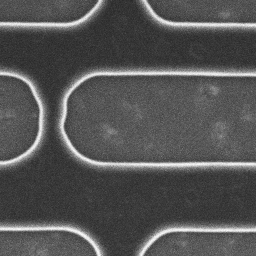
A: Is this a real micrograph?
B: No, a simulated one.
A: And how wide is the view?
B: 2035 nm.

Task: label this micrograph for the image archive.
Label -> one or a few lines or trenches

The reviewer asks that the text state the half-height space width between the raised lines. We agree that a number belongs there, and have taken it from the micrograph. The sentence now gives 89.5 px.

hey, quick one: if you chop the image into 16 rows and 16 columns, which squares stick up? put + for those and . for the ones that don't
......+++.......
++..+++++++.....
++++++++++++++++
++++++++++++++++
++++++++++++++++
..+++...........
..++............
...+............
..++............
..+++...........
++++++++++++++++
++++++++++++++++
++++++++++++++++
++++++++++++++++
.....+++++......
......+++.......